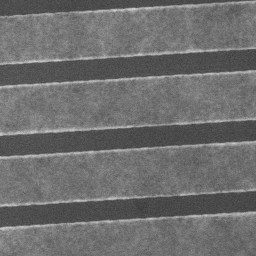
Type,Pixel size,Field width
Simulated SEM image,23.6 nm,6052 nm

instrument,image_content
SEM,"lines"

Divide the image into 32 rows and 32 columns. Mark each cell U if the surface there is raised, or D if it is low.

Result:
DDDDDDDDDDDDDDDDDDDDDDDDDDUUUUUU
DDDDDDDDDDUUUUUUUUUUUUUUUUUUUUUU
UUUUUUUUUUUUUUUUUUUUUUUUUUUUUUUU
UUUUUUUUUUUUUUUUUUUUUUUUUUUUUUUU
UUUUUUUUUUUUUUUUUUUUUUUUUUUUUUUU
UUUUUUUUUUUUUUUUUUUUUUUUUUUUUUUU
UUUUUUUUUUUUUUUUUUUUUUUUDDDDDDDD
UUUUUUUUDDDDDDDDDDDDDDDDDDDDDDDD
DDDDDDDDDDDDDDDDDDDDDDDDDDDDDDDD
DDDDDDDDDDDDDDDDDDDDDUUUUUUUUUUU
DDDDDDUUUUUUUUUUUUUUUUUUUUUUUUUU
UUUUUUUUUUUUUUUUUUUUUUUUUUUUUUUU
UUUUUUUUUUUUUUUUUUUUUUUUUUUUUUUU
UUUUUUUUUUUUUUUUUUUUUUUUUUUUUUUU
UUUUUUUUUUUUUUUUUUUUUUUUUUUUUUUU
UUUUUUUUUUUUUUUUUUUUUUDDDDDDDDDD
UUUUUUDDDDDDDDDDDDDDDDDDDDDDDDDD
DDDDDDDDDDDDDDDDDDDDDDDDDDDDDDDD
DDDDDDDDDDDDDDDDDDDUUUUUUUUUUUUU
DDDUUUUUUUUUUUUUUUUUUUUUUUUUUUUU
UUUUUUUUUUUUUUUUUUUUUUUUUUUUUUUU
UUUUUUUUUUUUUUUUUUUUUUUUUUUUUUUU
UUUUUUUUUUUUUUUUUUUUUUUUUUUUUUUU
UUUUUUUUUUUUUUUUUUUUUUUUUUUUUUUU
UUUUUUUUUUUUUUUUUUUUDDDDDDDDDDDD
UUUUDDDDDDDDDDDDDDDDDDDDDDDDDDDD
DDDDDDDDDDDDDDDDDDDDDDDDDDDDDDDD
DDDDDDDDDDDDDDDDUUUUUUUUUUUUUUUU
UUUUUUUUUUUUUUUUUUUUUUUUUUUUUUUU
UUUUUUUUUUUUUUUUUUUUUUUUUUUUUUUU
UUUUUUUUUUUUUUUUUUUUUUUUUUUUUUUU
UUUUUUUUUUUUUUUUUUUUUUUUUUUUUUUU